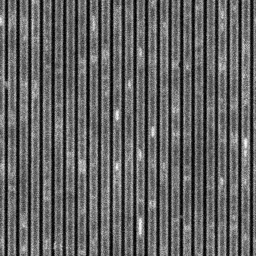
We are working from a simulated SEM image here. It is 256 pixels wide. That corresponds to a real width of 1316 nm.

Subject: parallel lines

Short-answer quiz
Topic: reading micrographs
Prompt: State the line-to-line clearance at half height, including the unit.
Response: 0.0238 µm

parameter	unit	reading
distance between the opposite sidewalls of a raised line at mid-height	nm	38.6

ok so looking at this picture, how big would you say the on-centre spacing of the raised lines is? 60 nm